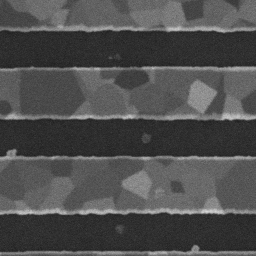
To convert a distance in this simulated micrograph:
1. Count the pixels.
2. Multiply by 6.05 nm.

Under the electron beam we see lines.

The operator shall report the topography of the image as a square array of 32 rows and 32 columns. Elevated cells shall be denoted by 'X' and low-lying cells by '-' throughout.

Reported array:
XXXXXXXXXXXXXXXXXXXXXXXXXXXXXXXX
XXXXXXXXXXXXXXXXXXXXXXXXXXXXXXXX
XXXXXXXXXXXXXXXXXXXXXXXXXXXXXXXX
XXXXXXXXXXXXXXXXXXXXXXXXXXXXXXXX
--------------------------------
--------------------------------
--------------------------------
--------------------------------
------------------XXXXX---X--XXX
XXXXXXXXXXXXXXXXXXXXXXXXXXXXXXXX
XXXXXXXXXXXXXXXXXXXXXXXXXXXXXXXX
XXXXXXXXXXXXXXXXXXXXXXXXXXXXXXXX
XXXXXXXXXXXXXXXXXXXXXXXXXXXXXXXX
XXXXXXXXXXXXXXXXXXXXXXXXXXXXXXXX
XXXXXXXXXXXXXXXXXXXXXXXXXXXXXXXX
--------------------------------
--------------------------------
--------------------------------
--------------------------------
--------------------------------
XXXXXXXXXXXXXXXXXXXXXXXXXXXXXXXX
XXXXXXXXXXXXXXXXXXXXXXXXXXXXXXXX
XXXXXXXXXXXXXXXXXXXXXXXXXXXXXXXX
XXXXXXXXXXXXXXXXXXXXXXXXXXXXXXXX
XXXXXXXXXXXXXXXXXXXXXXXXXXXXXXXX
XXXXXXXXXXXXXXXXXXXXXXXXXXXXXXXX
XXXXXXXXXXXXXXXXXXXXXXXXXXXXXXXX
--------------------------------
--------------------------------
--------------------------------
--------------------------------
----XXXXX-XXXXXXX-X-XXXXXXXXXXXX